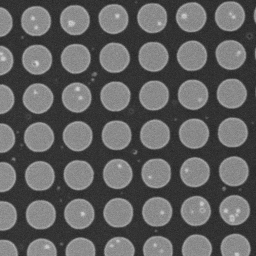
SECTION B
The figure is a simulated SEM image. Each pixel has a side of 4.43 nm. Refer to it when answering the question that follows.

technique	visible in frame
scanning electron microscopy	an array of small figures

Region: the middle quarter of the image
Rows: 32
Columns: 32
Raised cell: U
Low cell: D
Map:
UUUUUUDDDDUUUUUUDDDUUUUUUDDDDUUU
DUUUUDDDDDDUUUUDDDDDDUUUDDDDDDDU
DDDDDDDDDDDDDDDDDDDDDDDDDDDDDDDD
DDDDDDDDDDDDDDDDDDDDDDDDDDDDDDDD
DDDDDDDDDDDDDDDDDDDDDUUUDDDDDDUU
DUUUUDDDDDUUUUUDDDDDUUUUUDDDDUUU
UUUUUUDDDUUUUUUUDDDUUUUUUUDDDUUU
UUUUUUUDDUUUUUUUUDDUUUUUUUDDDUUU
UUUUUUUDDUUUUUUUDDDUUUUUUUDDDUUU
UUUUUUUDDDUUUUUUDDDUUUUUUUDDDUUU
UUUUUUDDDDUUUUUUDDDDUUUUUDDDDDUU
DUUUUDDDDDDUUUDDDDDDDDDDDDDDDDDD
DDDDDDDDDDDDDDDDDDDDDDDDDDDDDDDD
DDDDDDDDDDDDDDDDDDDDDDDDDDDDDDDD
DDDUUDDDDDDDUUUDDDDDDUUUDDDDDDUU
DUUUUUDDDDUUUUUUDDDDUUUUUUDDDUUU
UUUUUUUDDDUUUUUUUDDUUUUUUUDDDUUU
UUUUUUUDDDUUUUUUUDDUUUUUUUDDDUUU
UUUUUUUDDDUUUUUUUDDUUUUUUUDDDUUU
UUUUUUUDDDUUUUUUDDDUUUUUUUDDDDUU
DUUUUUDDDDDUUUUUDDDDUUUUUDDDDDDU
DDUUUDDDDDDDDDDDDDDDDDDDDDDDDDDD
DDDDDDDDDDDDDDDDDDDDDDDDDDDDDDDD
DDDDDDDDDDDDDDDDDDDDDDDDDDDDDDDD
DDUUUDDDDDDUUUUDDDDDDUUUUUDDDDUU
DUUUUUDDDDUUUUUUDDDDUUUUUUDDDUUU
UUUUUUUDDDUUUUUUUDDDUUUUUUDDDUUU
UUUUUUUDDDUUUUUUUDDUUUUUUUDDDUUU
UUUUUUUDDDUUUUUUUDDDUUUUUUUDDUUU
DUUUUUUDDDUUUUUUDDDDUUUUUUDDDDUU
DUUUUUDDDDDUUUUDDDDDDUUUUDDDDDDU
DDDDDDDDDDDDDDDDDDDDDDDDDDDDDDDD